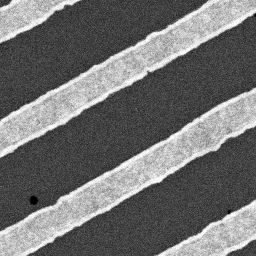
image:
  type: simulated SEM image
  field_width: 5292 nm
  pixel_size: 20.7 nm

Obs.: one or a few lines or trenches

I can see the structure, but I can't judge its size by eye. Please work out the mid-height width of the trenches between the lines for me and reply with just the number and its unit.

1420 nm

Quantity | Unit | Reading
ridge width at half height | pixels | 28.8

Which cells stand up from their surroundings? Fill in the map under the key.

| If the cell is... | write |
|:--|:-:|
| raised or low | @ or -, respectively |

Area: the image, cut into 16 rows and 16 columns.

@@@@---------@@@
@@---------@@@@-
---------@@@@---
-------@@@@-----
------@@@-------
----@@@---------
--@@@@--------@@
@@@@--------@@@@
@@---------@@@--
---------@@@@---
-------@@@@-----
------@@@-------
----@@@@--------
--@@@@--------@@
@@@@---------@@@
@@---------@@@@-